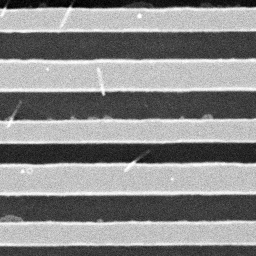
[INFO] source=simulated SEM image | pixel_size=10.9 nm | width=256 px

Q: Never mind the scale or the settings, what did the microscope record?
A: lines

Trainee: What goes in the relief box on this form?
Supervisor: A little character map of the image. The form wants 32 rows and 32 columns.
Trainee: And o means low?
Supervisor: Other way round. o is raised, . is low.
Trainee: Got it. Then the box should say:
................................
oooooooooooooooooooooooooooooooo
oooooooooooooooooooooooooooooooo
oooooooooooooooooooooooooooooooo
................................
................................
................................
ooooo.......oooo..o.oooooooooooo
oooooooooooooooooooooooooooooooo
oooooooooooooooooooooooooooooooo
oooooooooooooooooooooooooooooooo
............o...................
................................
................................
................................
oooooooooooooooooooooooooooooooo
oooooooooooooooooooooooooooooooo
oooooooooooooooooooooooooooooooo
................................
................................
............o.oooo.....ooooooo..
oooooooooooooooooooooooooooooooo
oooooooooooooooooooooooooooooooo
oooooooooooooooooooooooooooooooo
................................
................................
................................
................................
oooooooooooooooooooooooooooooooo
oooooooooooooooooooooooooooooooo
ooooooooooooooooooooooooooo..ooo
................................